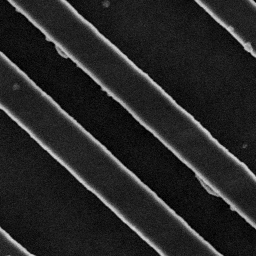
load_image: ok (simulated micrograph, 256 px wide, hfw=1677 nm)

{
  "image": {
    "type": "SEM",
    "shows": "lines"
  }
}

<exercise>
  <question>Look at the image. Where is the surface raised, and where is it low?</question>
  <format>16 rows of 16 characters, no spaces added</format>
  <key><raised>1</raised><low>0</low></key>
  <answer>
0111100000000111
0011110000000011
0001111000000001
0000111100000000
1000011110000000
1100001111000000
1111000011100000
0111100001110000
0011110000111000
0001111000011100
0000111100001110
0000011110000111
0000001111000011
0000000111100001
0000000011110000
1000000000111000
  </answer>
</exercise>